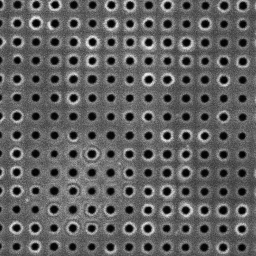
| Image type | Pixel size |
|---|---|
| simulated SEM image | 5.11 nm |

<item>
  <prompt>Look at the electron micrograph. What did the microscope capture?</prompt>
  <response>a regular array of holes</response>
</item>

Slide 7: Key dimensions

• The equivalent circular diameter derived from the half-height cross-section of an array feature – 40.4 nm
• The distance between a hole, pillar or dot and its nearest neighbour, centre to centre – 0.0935 microns